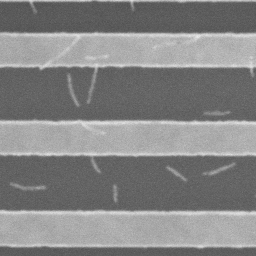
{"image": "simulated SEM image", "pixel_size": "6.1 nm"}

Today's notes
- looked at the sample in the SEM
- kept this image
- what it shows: lines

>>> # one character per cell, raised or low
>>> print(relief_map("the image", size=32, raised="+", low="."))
................................
................................
................................
................................
++++++++++++++++++++++++++++++++
++++++++++++++++++++++++++++++++
++++++++++++++++++++++++++++++++
++++++++++++++++++++++++++++++++
...............................+
................................
................................
................................
................................
................................
................................
++++++++++++++++++++++++++++++++
++++++++++++++++++++++++++++++++
++++++++++++++++++++++++++++++++
++++++++++++++++++++++++++++++++
................++..............
................................
................................
................................
................................
................................
................................
++++++++++++++++++++.+++++++++..
++++++++++++++++++++++++++++++++
++++++++++++++++++++++++++++++++
++++++++++++++++++++++++++++++++
++++++++++++++++++++++++++++++++
................................